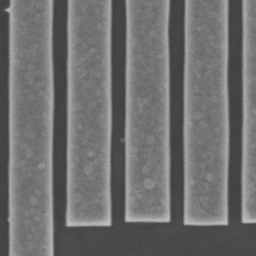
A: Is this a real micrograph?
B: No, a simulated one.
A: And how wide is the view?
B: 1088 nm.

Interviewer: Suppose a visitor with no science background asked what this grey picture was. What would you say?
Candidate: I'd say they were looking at parallel lines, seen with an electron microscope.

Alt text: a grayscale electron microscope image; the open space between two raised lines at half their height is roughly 0.0653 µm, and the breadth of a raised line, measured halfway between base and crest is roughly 181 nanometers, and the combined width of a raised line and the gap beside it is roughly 248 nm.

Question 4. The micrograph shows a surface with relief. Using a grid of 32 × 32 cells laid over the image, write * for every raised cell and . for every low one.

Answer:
.******..*****..*****..*****..**
.******..*****..*****..*****..**
.******..*****..*****..*****..**
.*****...*****..*****..*****...*
.*****...*****..*****..*****...*
.*****...*****..*****..*****..**
.*****...*****..*****..*****..**
.*****...*****..*****..*****..**
.*****...*****..*****..*****..**
.******..*****..*****..*****..**
.******..*****..*****..*****..**
.******..*****..*****..*****..**
.******..*****..*****..*****...*
.******..*****..*****..*****...*
.*****...*****..*****..*****...*
.*****...*****..*****..*****...*
.*****...*****..*****..*****...*
.*****...*****..*****..*****...*
.*****..******..*****..*****...*
.*****..******..*****..*****..**
.*****..******..*****..*****..**
.*****..******..*****..*****..**
.*****..******..*****..*****..**
.*****..******..*****..*****..**
.*****..******..*****..*****..**
.******.******..*****..*****..**
.******.******..*****..*****..**
.******.******..*****..*****...*
.******.........................
.******.........................
.******.........................
.******.........................